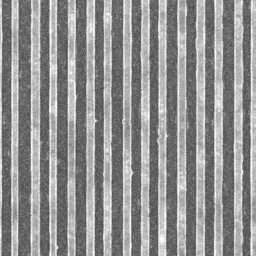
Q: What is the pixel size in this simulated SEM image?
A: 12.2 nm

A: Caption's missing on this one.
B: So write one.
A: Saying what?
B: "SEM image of parallel lines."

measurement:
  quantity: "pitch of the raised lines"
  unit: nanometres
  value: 228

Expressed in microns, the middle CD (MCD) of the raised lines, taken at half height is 0.0825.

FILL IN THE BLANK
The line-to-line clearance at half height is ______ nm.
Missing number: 134